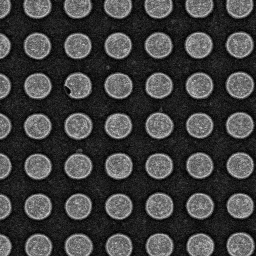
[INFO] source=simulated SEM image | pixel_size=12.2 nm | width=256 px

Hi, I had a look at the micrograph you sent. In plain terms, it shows a regular array of raised bodies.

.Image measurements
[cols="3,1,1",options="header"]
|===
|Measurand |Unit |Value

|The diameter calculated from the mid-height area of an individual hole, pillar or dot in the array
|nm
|319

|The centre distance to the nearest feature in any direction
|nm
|491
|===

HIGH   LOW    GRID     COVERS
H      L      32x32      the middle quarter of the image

LLLLLLLLLLLLLLLLLLLLLLLLLLLLLLLL
LLLLLLLLLLLLLLLLLLLLLLLLLLLLLLLL
LLHHHLLLLLLLLHHLLLLLLLLHHLLLLLLL
LHHHHHLLLLLHHHHHLLLLLHHHHHLLLLLH
HHHHHHHLLLHHHHHHHLLLLHHHHHHLLLLH
LHHHHHHLLLHHHHHHHLLLLHHHHHHLLLLH
LLHHHHHLLLHHHHHHHLLLLHHHHHHLLLLH
LLHHHHLLLLLHHHHHLLLLLHHHHHLLLLLH
LLHHHLLLLLLLLLLLLLLLLLLLLLLLLLLL
LLLLLLLLLLLLLLLLLLLLLLLLLLLLLLLL
LLLLLLLLLLLLLLLLLLLLLLLLLLLLLLLL
LLLLLLLLLLLLLLLLLLLLLLLLLLLLLLLL
LLLHHLLLLLLLLLLLLLLLLLLHHLLLLLLL
LHHHHHLLLLLHHHHHLLLLLHHHHHLLLLLH
HHHHHHHLLLLHHHHHHLLLLHHHHHHLLLLH
HHHHHHHLLLHHHHHHHLLLLHHHHHHLLLLH
HHHHHHHLLLLHHHHHHLLLLHHHHHHLLLLH
LHHHHHLLLLLHHHHHLLLLLHHHHHLLLLLL
LLHHHLLLLLLLLLLLLLLLLLLLLLLLLLLL
LLLLLLLLLLLLLLLLLLLLLLLLLLLLLLLL
LLLLLLLLLLLLLLLLLLLLLLLLLLLLLLLL
LLLLLLLLLLLLLLLLLLLLLLLLLLLLLLLL
LLLLLLLLLLLLLLLLLLLLLLLLLLLLLLLL
LHHHHHLLLLLHHHHHLLLLLHHHHHLLLLLH
LHHHHHHLLLLHHHHHHLLLLHHHHHHLLLLH
HHHHHHHLLLLHHHHHHLLLLHHHHHHLLLLH
HHHHHHHLLLLHHHHHHLLLLHHHHHHLLLLH
LHHHHHLLLLLHHHHHLLLLLHHHHHLLLLLL
LLHHHLLLLLLLLHLLLLLLLLLHHLLLLLLL
LLLLLLLLLLLLLLLLLLLLLLLLLLLLLLLL
LLLLLLLLLLLLLLLLLLLLLLLLLLLLLLLL
LLLLLLLLLLLLLLLLLLLLLLLLLLLLLLLL